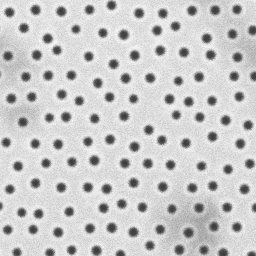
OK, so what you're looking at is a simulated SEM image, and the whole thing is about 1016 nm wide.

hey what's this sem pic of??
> a regular array of holes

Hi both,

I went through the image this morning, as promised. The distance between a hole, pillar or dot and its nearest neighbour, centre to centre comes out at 83.5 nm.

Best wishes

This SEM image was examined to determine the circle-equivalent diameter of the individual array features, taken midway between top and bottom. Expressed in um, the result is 0.0401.